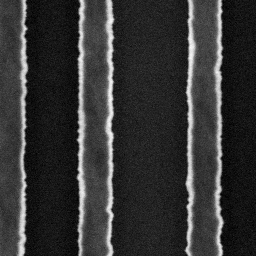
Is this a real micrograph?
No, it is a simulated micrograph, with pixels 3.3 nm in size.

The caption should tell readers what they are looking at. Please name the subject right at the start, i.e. lines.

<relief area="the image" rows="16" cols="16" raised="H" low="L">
HHLLLHHLLLLLHHLL
HHLLLHHLLLLLHHLL
HHLLLHHLLLLLHHLL
HHLLLHHLLLLLHHLL
HHLLLHHLLLLLHHLL
HHLLLHHLLLLLHHLL
HHLLLHHLLLLLHHLL
HHLLLHHLLLLLHHLL
HHLLLHHLLLLLHHLL
HHLLLHHLLLLLHHLL
HLLLLHHLLLLLHHLL
HHLLLHHLLLLLHHLL
HHLLLHHLLLLLHHLL
HHLLLHHLLLLLHHLL
HHLLLHHLLLLLHHLL
HLLLLHHLLLLLHHLL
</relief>